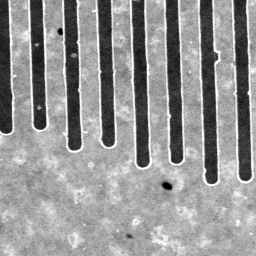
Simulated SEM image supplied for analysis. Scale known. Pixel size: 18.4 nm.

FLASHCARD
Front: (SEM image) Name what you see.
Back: parallel lines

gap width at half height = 347 nm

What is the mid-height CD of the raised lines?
278 nanometers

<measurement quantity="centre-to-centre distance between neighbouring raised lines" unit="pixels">33.9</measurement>